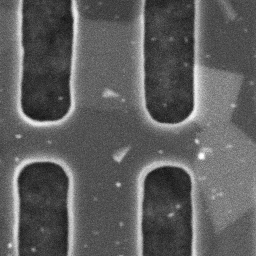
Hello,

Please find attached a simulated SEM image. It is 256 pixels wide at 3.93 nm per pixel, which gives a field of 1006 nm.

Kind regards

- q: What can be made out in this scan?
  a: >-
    holes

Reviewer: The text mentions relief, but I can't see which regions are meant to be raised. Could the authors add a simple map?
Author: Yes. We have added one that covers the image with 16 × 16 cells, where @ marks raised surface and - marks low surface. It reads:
@----@@@@---@@@@
@----@@@@---@@@@
@----@@@@---@@@@
@---@@@@@---@@@@
@---@@@@@---@@@@
@---@@@@@---@@@@
@---@@@@@---@@@@
@@--@@@@@@--@@@@
@@@@@@@@@@@@@@@@
@@@@@@@@@@@@@@@@
@---@@@@@@-@@@@@
@---@@@@@---@@@@
@---@@@@@---@@@@
@---@@@@@---@@@@
@---@@@@@---@@@@
@---@@@@@---@@@@